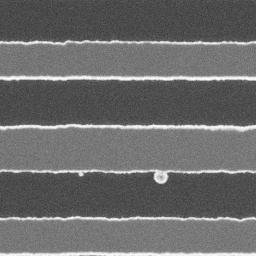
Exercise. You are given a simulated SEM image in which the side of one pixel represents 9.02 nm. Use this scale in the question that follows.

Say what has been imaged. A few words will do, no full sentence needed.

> lines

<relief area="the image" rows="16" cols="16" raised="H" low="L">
LLLLLLLLLLLLLLLL
LLLLLLLLLLLLLLLL
LLLLLLLLLLLLLLLL
HHHHHHHHHHHHHHHH
HHHHHHHHHHHHHHHH
LLLLLLLLLLLLLLLL
LLLLLLLLLLLLLLLL
LLLLLLLLLLLLLLLL
HHHHHHHHHHHHHHHH
HHHHHHHHHHHHHHHH
HHHHHHHHHHHHHHHH
LLLLLLLLLLLLLLLL
LLLLLLLLLLLLLLLL
LLLLLLLLLLLLLLLL
HHHHHHHHHHHHHHHH
HHHHHHHHHHHHHHHH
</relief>